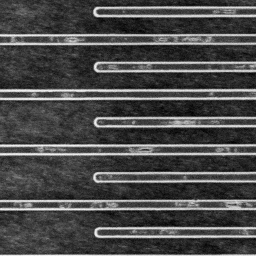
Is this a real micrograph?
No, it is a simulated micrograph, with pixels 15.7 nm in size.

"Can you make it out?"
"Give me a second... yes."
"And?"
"parallel lines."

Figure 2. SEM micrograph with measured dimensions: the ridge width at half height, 9.12 px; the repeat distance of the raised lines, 434 nanometres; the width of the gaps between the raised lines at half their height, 291 nm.